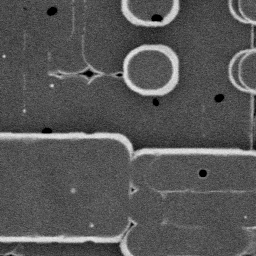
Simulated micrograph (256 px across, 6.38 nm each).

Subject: wiring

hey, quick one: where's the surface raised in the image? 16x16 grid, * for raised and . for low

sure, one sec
........***....*
................
................
........***....*
........***....*
........**......
................
................
................
***************.
****************
****************
****************
****************
****************
........********